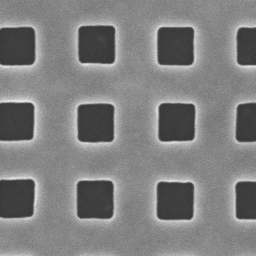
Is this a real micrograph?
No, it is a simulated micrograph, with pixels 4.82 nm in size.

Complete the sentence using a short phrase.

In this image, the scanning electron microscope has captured holes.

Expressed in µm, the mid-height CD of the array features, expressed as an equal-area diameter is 0.204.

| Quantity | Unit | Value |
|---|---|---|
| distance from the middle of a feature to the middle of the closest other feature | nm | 370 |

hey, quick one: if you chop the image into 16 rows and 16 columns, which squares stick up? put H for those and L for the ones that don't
HHHHHHHHHHHHHHHH
HHHHHHHHHHHHHHHH
LLHHHLLHHHLLHHHL
LLHHHLLHHHLLHHHL
HHHHHHHHHHHHHHHH
HHHHHHHHHHHHHHHH
LLHHHLLHHHLLHHHL
LLHHHLLHHHLLHHHL
LLHHHLLHHHLLHHHL
HHHHHHHHHHHHHHHH
HHHHHHHHHHHHHHHH
LLHHHLLHHHLLHHHL
LLHHHLLHHHLLHHHL
LLHHHLLHHHLLHHHL
HHHHHHHHHHHHHHHH
HHHHHHHHHHHHHHHH